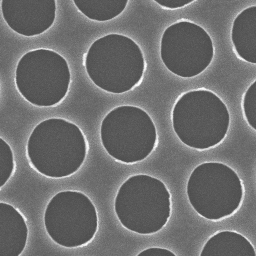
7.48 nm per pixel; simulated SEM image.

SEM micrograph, a regular array of holes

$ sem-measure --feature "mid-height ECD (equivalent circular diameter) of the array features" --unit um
0.418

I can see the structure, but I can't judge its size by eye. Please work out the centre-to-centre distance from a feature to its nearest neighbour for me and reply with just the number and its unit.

71.9 px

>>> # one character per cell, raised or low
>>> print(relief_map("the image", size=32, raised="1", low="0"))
00000001100000001111000111111111
00000001110000011111111111111100
10000001111101111111111111111000
10000011111111111111100001111000
11101111111110001111000000111000
11111111111100000111000000011000
11110001111000000011000000011100
11100000111000000011000000111110
11000000011000000011100000111111
11000000011000000011111011111111
11000000011100000111111111111111
11100000111111011111111100111110
11100000111111111111110000001110
11111111111111100111110000001100
11111111111110000001110000000110
11111000011110000001110000000110
11110000001110000001110000001111
11110000000110000001111000001111
01100000000110000001111100111111
00110000000111000011111111111111
00110000001111111111111110001111
01111000011111111111111100000111
01111111111111110000111100000011
11111111111111100000011000000011
11111110000111100000011100000011
01111100000011000000011100000011
00111100000011100000011110000111
00011100000011100000011111111111
00011100000011110000111111111111
00011100000011111111111111100011
00011110001111111111111111000001
00011111111111111100011110000000